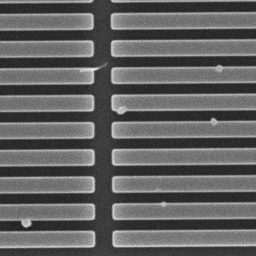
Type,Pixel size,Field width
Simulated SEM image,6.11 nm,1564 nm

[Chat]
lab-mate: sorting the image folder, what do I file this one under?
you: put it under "groups of lines, slits or small figures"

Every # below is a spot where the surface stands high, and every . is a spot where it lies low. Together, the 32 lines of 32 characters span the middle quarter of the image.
................................
########....####################
#######.....####################
#######.....####################
#######.....####################
................................
................................
................................
#######.....####################
#######.....####################
#######.....####################
#######.....#####...............
................................
................................
................................
#######.....####################
#######.....####################
#######.....####################
#######.........................
................................
................................
....###.....####################
#######.....####################
#######.....####################
#######.....####################
................................
................................
................................
#######.....####################
#######.....####################
#######.....####################
#######.....####################